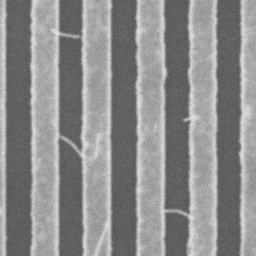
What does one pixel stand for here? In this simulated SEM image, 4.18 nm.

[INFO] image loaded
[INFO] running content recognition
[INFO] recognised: lines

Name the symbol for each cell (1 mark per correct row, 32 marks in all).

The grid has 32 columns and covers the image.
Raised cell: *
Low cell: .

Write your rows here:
*...***...****...***....***...**
*...***...****...***....***...**
*...***...****...****...***...**
*...***...****...****...***...**
....***...****...***....***...**
*...***...****...****...***...**
*...***...****...****...***...**
*...***...****...***....***...**
....***...****...****...***...**
....***...****...****...***...**
*...***....***...****...***...**
*...***...****...***....***...**
*...***...****...****...***...**
....***...****...***....***...**
*...***...****...***....***...**
*...***...****...***....***...**
*...***...****...***....***...**
*...***...****...***....***...**
*...***...****...****...***...**
....***...****...****...***...**
*...***...****...***....***...**
*...***...****...***....***...**
*...***...****...****...***...**
*...***...****...***....***...**
*...***...****...***....***...**
*...***...****...***....***...**
*...***...****...****...***...**
*...***....***...****...***...**
....***....***...****...***...**
*...***....***...***....***...**
*...***...****...****...***...**
*...***....***...****...***...**